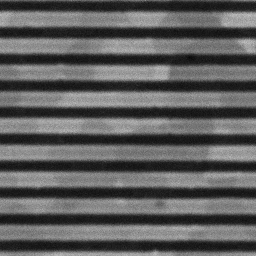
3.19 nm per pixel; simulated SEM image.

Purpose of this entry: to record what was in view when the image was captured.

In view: parallel lines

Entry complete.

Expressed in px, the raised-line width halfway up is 13.4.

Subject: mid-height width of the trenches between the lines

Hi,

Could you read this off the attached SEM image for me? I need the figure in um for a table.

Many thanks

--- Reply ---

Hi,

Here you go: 0.0426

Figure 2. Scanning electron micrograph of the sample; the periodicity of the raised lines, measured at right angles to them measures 0.0849 microns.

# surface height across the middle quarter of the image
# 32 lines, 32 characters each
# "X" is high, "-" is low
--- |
X-------------------------------
XXXXXXXXXXXXXXXXXXXXXXXXXXXXXXXX
XXXXXXXXXXXXXXXXXXXXXXXXXXXXXXXX
XXXXXXXXXXXXXXXXXXXXXXXXXXXXXXXX
--------------------------------
--------------------------------
--------------------------------
XXXXXXXXXXXXXXXXXXXXXXXXXXXXXXXX
XXXXXXXXXXXXXXXXXXXXXXXXXXXXXXXX
XXXXXXXXXXXXXXXXXXXXXXXXXXXXXXXX
--------------------------------
--------------------------------
--------------------------------
--------------------------------
XXXXXXXXXXXXXXXXXXXXXXXXXXXXXXXX
XXXXXXXXXXXXXXXXXXXXXXXXXXXXXXXX
XXXXXXXXXXXXXXXXXXXXXXXXXXXXXXXX
--------------------------------
--------------------------------
--------------------------------
--------------------------------
XXXXXXXXXXXXXXXXXXXXXXXXXXXXXXXX
XXXXXXXXXXXXXXXXXXXXXXXXXXXXXXXX
XXXXXXXXXXXXXXXXXXXXXXXXXXXXXXXX
--------------------------------
--------------------------------
--------------------------------
XXXXXXXXXXXXXXXXXXXXXXXX--X--XXX
XXXXXXXXXXXXXXXXXXXXXXXXXXXXXXXX
XXXXXXXXXXXXXXXXXXXXXXXXXXXXXXXX
----XXXXXXXXX-X--XX--X--------XX
--------------------------------